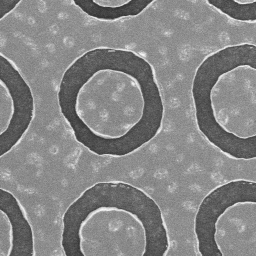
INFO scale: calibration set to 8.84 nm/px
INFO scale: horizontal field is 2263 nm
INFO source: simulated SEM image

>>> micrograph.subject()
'ring-shaped grooves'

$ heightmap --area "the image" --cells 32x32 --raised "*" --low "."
..********..****...*******......
.**********.......**********....
******************************..
********************************
********************************
********************************
***********.....***********.....
.*********........********......
..*******..........******....***
...*****....****...*****....****
...*****...******...****...*****
*...***...********..****..******
**..***...********..****..******
**..****..********..****...*****
**..****..********..*****..*****
*...*****..******...*****..*****
...******...****....*****....***
..********.........*******......
.**********......**********.....
*****************************...
********************************
********************************
********************************
***********......**********.....
..********.........*******......
..*******..........******....***
...*****....****....*****...****
*..*****...******...****...*****
*...****..********...***...*****
*...****..********...****..*****
*...****..********...****..*****
*...****..********...****...****